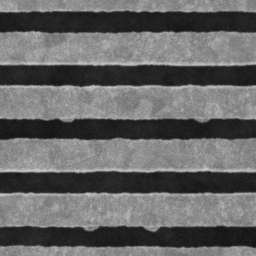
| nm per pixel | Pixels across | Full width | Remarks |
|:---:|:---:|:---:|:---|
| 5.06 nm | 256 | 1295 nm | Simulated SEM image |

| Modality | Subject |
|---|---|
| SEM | lines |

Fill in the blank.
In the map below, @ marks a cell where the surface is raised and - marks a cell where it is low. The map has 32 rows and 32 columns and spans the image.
@@@@@@@@@@@@@@@@@@@@@@@@@@@@@@@@
--------------------------------
--------------------------------
--------------------------------
@@@@@@@@@@@@@@@@@@@@@@@@@@@@@@@@
@@@@@@@@@@@@@@@@@@@@@@@@@@@@@@@@
@@@@@@@@@@@@@@@@@@@@@@@@@@@@@@@@
@@@@@@@@@@@@@@@@@@@@@@@@@@@@@@@@
--------------------------------
--------------------------------
--------------------------------
@@@@@@@@@@@@@@@@@@@@@@@@@@@@@@@@
@@@@@@@@@@@@@@@@@@@@@@@@@@@@@@@@
@@@@@@@@@@@@@@@@@@@@@@@@@@@@@@@@
@@@@@@@@@@@@@@@@@@@@@@@@@@@@@@@@
--------------------------------
--------------------------------
-@@@@@@@@@----@@@@@@@@@@@@@@@@@@
@@@@@@@@@@@@@@@@@@@@@@@@@@@@@@@@
@@@@@@@@@@@@@@@@@@@@@@@@@@@@@@@@
@@@@@@@@@@@@@@@@@@@@@@@@@@@@@@@@
--------------------------------
--------------------------------
--------------------------------
@@@@@@@@@@@@@@@@@@@@@@@@@@@@@@@@
@@@@@@@@@@@@@@@@@@@@@@@@@@@@@@@@
@@@@@@@@@@@@@@@@@@@@@@@@@@@@@@@@
@@@@@@@@@@@@@@@@@@@@@@@@@@@@@@@@
--------------------------------
--------------------------------
--------------------------------
@@@@@@@@@@@@@@@@@@@@@@@@@@@@@@@@